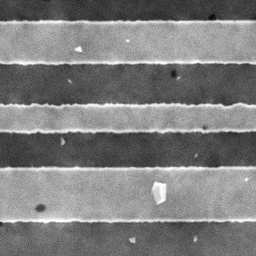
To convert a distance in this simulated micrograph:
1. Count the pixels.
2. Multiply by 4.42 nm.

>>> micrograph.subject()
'lines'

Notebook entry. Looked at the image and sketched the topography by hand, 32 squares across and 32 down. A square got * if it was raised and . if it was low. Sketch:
................................
................................
................................
********************************
********************************
********************************
********************************
********************************
................................
................................
................................
................................
................................
********************************
********************************
********************************
.*******...*..**....*....*......
................................
................................
................................
................................
********************************
********************************
********************************
********************************
********************************
********************************
********************************
................................
................................
................................
................................